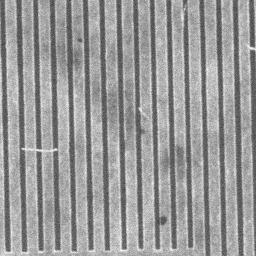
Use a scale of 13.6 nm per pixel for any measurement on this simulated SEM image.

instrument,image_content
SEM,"parallel lines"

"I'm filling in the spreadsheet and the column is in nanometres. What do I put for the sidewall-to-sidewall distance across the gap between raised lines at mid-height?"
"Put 88.7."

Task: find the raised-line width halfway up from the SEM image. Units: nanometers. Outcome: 136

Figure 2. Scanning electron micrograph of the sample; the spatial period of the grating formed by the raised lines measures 0.227 microns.